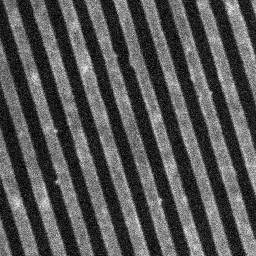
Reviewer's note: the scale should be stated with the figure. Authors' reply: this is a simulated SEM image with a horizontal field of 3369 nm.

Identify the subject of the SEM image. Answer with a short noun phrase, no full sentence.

parallel lines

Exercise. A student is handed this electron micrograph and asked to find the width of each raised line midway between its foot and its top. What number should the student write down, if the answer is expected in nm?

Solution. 156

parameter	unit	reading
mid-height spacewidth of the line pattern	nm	195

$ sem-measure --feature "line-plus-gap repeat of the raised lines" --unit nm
347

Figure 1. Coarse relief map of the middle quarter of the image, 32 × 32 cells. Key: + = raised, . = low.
....+++....+++...+++....+++....+
....+++....+++....+++....+++...+
....++++...+++....+++....+++....
+....+++....++.....++....+++....
+....+++....+++....++.....++....
+....+++....+++....+++....+++...
++...++++...+++.....++....+++...
++....+++....+++....+++....++...
++....+++....+++....+++....+++..
+++...++++...+++.....++....+++..
+++....+++...++++....+++...+++..
+++....+++....+++....+++....+++.
+++....++++...+++.....++....+++.
.+++...++++...+++.....++....+++.
.+++....+++....+++....+++....++.
.+++....++++...+++....+++....+++
..+++....+++....++.....++....+++
..+++....+++....+++....++.....++
..+++....+++....+++....+++....++
...+++....+++...+++....+++....++
...+++....+++....+++....++....++
...+++....+++....+++....+++....+
...++++...++++...+++....+++....+
....+++....+++....+++....++....+
....+++....+++....+++....+++....
+...+++....+++....+++....+++....
+....+++....+++....+++....++....
+....+++....+++....+++....++....
++...+++....+++....+++....+++...
++....+++....+++....++.....++...
++....+++....+++....+++....++...
++....+++....+++....+++....+++..